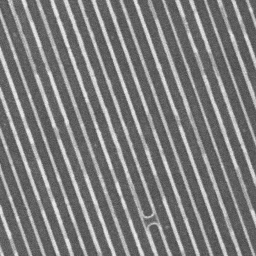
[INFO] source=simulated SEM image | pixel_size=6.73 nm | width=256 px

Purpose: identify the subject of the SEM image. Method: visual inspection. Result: parallel lines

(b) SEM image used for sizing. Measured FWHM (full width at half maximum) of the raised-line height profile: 19 nm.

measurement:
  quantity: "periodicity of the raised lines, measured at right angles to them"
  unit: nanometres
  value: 88.6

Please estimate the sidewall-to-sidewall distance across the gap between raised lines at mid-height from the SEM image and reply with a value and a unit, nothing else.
0.0714 um